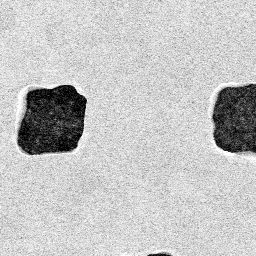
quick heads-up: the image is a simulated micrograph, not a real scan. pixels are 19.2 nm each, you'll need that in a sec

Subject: holes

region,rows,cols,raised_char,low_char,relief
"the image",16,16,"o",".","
oooooooooooooooo
oooooooooooooooo
oooooooooooooooo
oooooooooooooooo
oooooooooooooooo
ooo..ooooooooo..
oo...oooooooo...
o....oooooooo...
o....oooooooo...
o...oooooooooo..
oooooooooooooooo
oooooooooooooooo
oooooooooooooooo
oooooooooooooooo
oooooooooooooooo
oooooooooooooooo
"